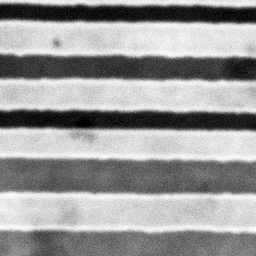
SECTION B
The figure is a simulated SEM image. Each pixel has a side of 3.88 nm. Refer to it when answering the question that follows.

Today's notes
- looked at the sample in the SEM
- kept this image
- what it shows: lines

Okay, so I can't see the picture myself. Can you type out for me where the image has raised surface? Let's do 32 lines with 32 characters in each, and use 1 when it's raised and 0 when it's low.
00000001000111011101101101111111
00000000000000000000000000000000
00000000000000000000000000000000
11111111111111111111111111111111
11111111111111111111111111111111
11111111111111111111111111111111
11111111111111111111111111111111
00000000000000000000000000000000
00000000000000000000000000000000
00000000000000000000000000000000
11111111111111111111111111111111
11111111111111111111111111111111
11111111111111111111111111111111
11111111111111111111111111111111
00000000000000000000000000000000
00000000000000000000000000000000
11111111111111111111111111111111
11111111111111111111111111111111
11111111111111111111111111111111
11111111111111111111111111111111
00000000000000000000000000000000
00000000000000000000000000000000
00000000000000000000000000000000
00000000000000000000000000000000
11111111111111111111111111111111
11111111111111111111111111111111
11111111111111111111111111111111
11111111111111111111111111111111
11111111111111111111111111111111
00000000000000000000000000000000
00000000000000000000000000000000
00000000000000000000000000000000